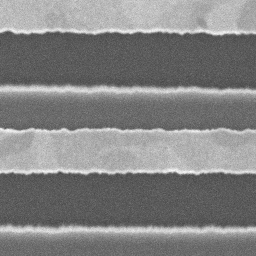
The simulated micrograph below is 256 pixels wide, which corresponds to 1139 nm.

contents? lines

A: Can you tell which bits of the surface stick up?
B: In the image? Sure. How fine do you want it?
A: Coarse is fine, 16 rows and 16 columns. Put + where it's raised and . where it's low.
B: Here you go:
++++++++++++++++
++++++++++++++++
................
................
................
................
++++++++++++++++
++++++++++++++++
++++++++++++++++
++++++++++++++++
++++++++++++++++
................
................
................
++++++++++++++++
++++++++++++++++